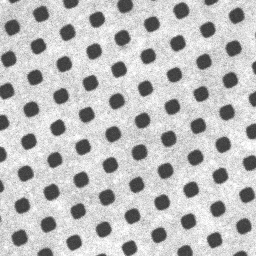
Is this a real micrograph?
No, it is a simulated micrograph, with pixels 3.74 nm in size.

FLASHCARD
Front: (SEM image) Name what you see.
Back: a regular array of holes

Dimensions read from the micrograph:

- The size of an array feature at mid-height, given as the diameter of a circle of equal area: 57.5 nanometres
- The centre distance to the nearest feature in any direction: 31.6 px